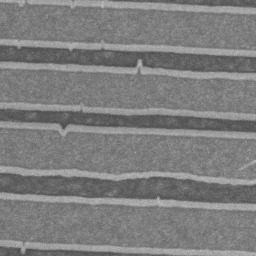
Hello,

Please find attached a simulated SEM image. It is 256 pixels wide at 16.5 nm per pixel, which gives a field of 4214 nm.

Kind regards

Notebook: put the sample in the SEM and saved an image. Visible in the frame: one or a few lines or trenches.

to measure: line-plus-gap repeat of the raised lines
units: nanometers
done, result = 1090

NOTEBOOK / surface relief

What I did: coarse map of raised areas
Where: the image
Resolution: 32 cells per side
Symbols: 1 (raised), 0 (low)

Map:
11111111111111000000000000000000
11111111111111111111111111111111
11111111111111111111111111111111
11111111111111111111111111111111
11111111111111111111111111111111
00101111111111111111111111111111
00000000000000000000000000011111
00000000000000000000000000000000
11111111101000000100000000000000
11111111111111111111111111111000
11111111111111111111111111111111
11111111111111111111111111111111
11111111111111111111111111111111
00000001011111111111111111111111
00000000000000000000000000000111
00000000000000000000000000000000
11111111111111111111100000000000
11111111111111111111111111111111
11111111111111111111111111111111
11111111111111111111111111111111
11111111111111111111111111111111
00011111111111111111111111111111
00000000000000000000000000011111
00000000000000000000000000000000
10000000000000000000000000000000
11111111111111111111111000000000
11111111111111111111111111111111
11111111111111111111111111111111
11111111111111111111111111111111
11111111111111111111111111111111
00111111111111111111111111111111
00000000000000000000001101111111